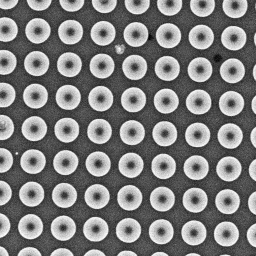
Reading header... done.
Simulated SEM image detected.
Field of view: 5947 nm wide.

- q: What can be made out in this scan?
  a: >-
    an array of small figures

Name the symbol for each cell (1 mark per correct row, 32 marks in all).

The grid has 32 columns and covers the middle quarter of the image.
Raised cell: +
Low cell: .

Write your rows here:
++++..++++++...++++++..++++++..+
++++...+++++...++++++..++++++..+
+++....+++++...+++++...++++++..+
.........+......+++.....++++....
................................
++..............................
+++....++++.....+++.....+++.....
++++..++++++...+++++...+++++...+
++++..++++++..++++++...+++++...+
++++..++++++..++++++...++++++..+
+++....+++++...+++++...+++++...+
........++......+++....+++++...+
................................
................................
+++....++++.....++......++......
++++..++++++..++++++...++++....+
++++..++++++..++++++..++++++...+
++++..++++++..++++++..++++++..++
+++...+++++...++++++..++++++..++
++.....+++.....++++....+++++...+
................................
................................
+++....+++......++..............
+++...+++++...+++++....++++....+
+++...++++++..++++++..++++++..++
+++...+++++...++++++..++++++..++
+++...+++++...++++++..++++++..++
+......+++.....++++....++++....+
........................++......
................................
++.....+++.....++...............
+++...+++++...+++++....++++....+